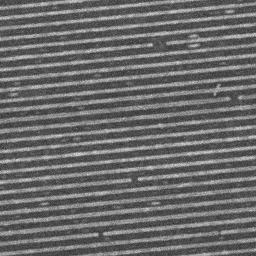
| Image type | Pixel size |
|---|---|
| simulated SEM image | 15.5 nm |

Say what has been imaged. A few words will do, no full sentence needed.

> parallel lines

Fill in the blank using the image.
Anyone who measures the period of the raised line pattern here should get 0.158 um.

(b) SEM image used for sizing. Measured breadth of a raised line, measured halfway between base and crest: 0.0442 µm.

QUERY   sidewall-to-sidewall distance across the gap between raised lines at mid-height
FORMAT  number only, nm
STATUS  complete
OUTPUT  115